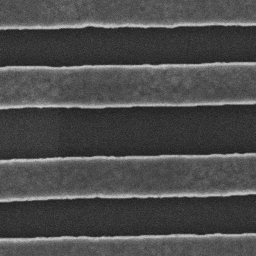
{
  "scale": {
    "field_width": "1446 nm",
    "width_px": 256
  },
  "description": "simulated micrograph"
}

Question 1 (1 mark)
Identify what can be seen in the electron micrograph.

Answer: lines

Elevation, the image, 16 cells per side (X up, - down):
XXXXXXXXXXXXXXXX
XXXXXXXXXXXXXXXX
----------------
----------------
XXXXXXXXXXXXXXXX
XXXXXXXXXXXXXXXX
XXXXXXXXXXXXXX--
----------------
----------------
----------------
XXXXXXXXXXXXXXXX
XXXXXXXXXXXXXXXX
XX--------------
----------------
----------------
XXXXXXXXXXXXXXXX